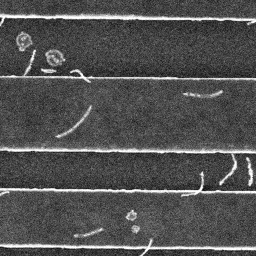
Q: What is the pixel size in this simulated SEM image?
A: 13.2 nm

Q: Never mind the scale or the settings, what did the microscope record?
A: lines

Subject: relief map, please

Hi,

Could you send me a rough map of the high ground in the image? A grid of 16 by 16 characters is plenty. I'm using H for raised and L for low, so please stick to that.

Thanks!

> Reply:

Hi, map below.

HHHHHHHHHHHHHHHH
LLLLLLLLLLLLLLLL
LLLLLLLLLLLLLLLL
LLLLLLLLLLLLLLLL
LLLLLLLLLLLLLLLL
HHHHHHHHHHHHHHHH
HHHHHHHHHHHHHHHH
HHHHHHHHHHHHHHHH
HHHHHHHHHHHHHHHH
LLLLLLLLLLLHHHHH
LLLLLLLLLLLLLLLL
LLLLLLLLLLLLLLLL
HHHHHHHHHHHHHHHH
HHHHHHHHHHHHHHHH
HHHHHHHHHHHHHHHH
LLLLLLLLHHHHHHHH